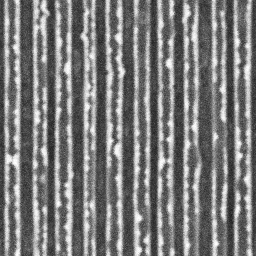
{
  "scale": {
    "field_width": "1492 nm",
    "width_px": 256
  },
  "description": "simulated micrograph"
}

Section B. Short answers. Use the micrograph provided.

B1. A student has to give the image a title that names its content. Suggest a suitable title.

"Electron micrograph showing parallel lines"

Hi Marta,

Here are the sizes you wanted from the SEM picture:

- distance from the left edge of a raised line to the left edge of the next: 149 nm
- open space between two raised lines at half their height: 64.1 nanometers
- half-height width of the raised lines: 85.2 nm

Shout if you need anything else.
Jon